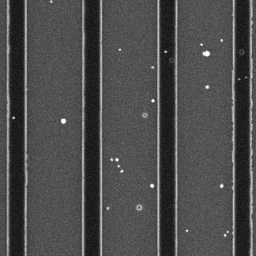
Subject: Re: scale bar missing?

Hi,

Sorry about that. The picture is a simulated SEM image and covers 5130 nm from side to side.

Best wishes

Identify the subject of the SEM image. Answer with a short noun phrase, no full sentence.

lines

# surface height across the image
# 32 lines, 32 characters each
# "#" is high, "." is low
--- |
.##.......###.......##.......##.
.##.......###.......##.......##.
.##.......###.......##.......##.
.##.......###.......##.......##.
.##.......###.......##.......##.
.##.......###.......##.......##.
.##.......###.......##.......##.
.##.......###.......##.......##.
.##.......###.......##.......##.
.##.......###.......##.......##.
.##.......###.......##.......##.
.##.......###.......##.......##.
.##.......###.......##.......##.
.##.......###.......##.......##.
.##.......###.......##.......##.
.##.......###.......##.......##.
.##.......###.......##.......##.
.##.......###.......##.......##.
.##.......###.......##.......##.
.##.......###.......##.......##.
.##.......###.......##.......##.
.##.......###.......##.......##.
.##.......###.......##.......##.
.##.......###.......##.......##.
.##.......###.......##.......##.
.##.......###.......##.......##.
.##.......###.......##.......##.
.##.......###.......##.......##.
.##.......###.......##.......##.
.##.......###.......##.......##.
.##.......###.......##.......##.
.##.......###.......##.......##.